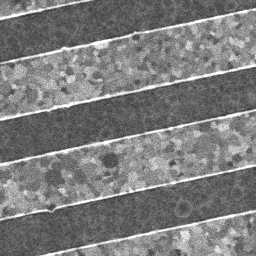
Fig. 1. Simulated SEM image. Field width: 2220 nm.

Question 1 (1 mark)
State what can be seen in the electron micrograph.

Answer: one or a few lines or trenches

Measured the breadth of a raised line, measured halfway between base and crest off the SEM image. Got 471 nm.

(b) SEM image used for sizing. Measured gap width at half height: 382 nanometers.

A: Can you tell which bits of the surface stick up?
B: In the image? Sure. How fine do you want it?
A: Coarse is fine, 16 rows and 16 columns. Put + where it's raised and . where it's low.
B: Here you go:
+++.............
............++++
.......+++++++++
..++++++++++++++
++++++++++++++..
+++++++++.......
+++++...........
.............+++
........++++++++
....++++++++++++
+++++++++++++++.
+++++++++++.....
++++++..........
+.............++
..........++++++
.....+++++++++++